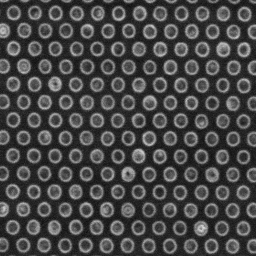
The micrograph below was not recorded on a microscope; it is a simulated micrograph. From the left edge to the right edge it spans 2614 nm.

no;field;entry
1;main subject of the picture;a regular array of raised bodies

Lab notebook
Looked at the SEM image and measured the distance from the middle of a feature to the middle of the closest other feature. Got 0.208 micrometres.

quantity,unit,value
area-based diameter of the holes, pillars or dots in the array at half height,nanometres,130